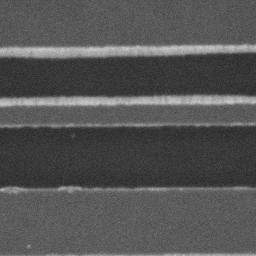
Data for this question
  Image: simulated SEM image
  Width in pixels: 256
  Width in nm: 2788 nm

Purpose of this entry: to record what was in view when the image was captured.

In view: lines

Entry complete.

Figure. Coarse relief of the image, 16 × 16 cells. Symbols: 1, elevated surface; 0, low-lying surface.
1111111111111111
1111111111111111
1111111111111111
0000000000000000
0000000000000000
0000000000000000
1111111111111111
1111111111111111
0000000000000000
0000000000000000
0000000000000000
0000000000000000
1111111111111111
1111111111111111
1111111111111111
1111111111111111